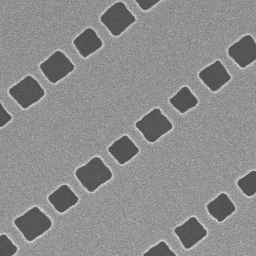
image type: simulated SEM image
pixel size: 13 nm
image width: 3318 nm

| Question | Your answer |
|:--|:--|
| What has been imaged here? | a regular array of holes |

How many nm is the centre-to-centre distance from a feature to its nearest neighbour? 506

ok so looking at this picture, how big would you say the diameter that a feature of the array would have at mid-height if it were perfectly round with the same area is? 0.357 µm